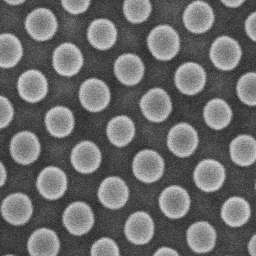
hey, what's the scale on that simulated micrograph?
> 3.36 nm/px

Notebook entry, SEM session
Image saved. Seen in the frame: a regular array of raised bodies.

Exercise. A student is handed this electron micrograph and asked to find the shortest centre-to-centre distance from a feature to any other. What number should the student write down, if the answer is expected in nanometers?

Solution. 145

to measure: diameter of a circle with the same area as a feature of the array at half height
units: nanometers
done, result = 101